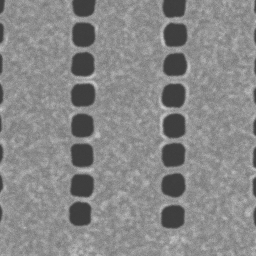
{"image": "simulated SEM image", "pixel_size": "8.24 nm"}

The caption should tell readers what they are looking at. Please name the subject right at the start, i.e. a regular array of holes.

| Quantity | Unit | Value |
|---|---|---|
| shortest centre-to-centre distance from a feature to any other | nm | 248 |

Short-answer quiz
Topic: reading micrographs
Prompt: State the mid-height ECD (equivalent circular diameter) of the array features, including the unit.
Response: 206 nanometres